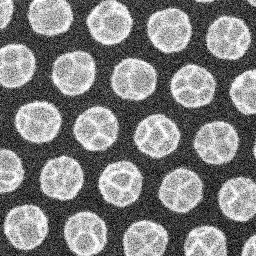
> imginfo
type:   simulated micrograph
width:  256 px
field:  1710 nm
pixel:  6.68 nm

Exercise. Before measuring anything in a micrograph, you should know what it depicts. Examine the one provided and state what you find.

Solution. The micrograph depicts a regular array of raised bodies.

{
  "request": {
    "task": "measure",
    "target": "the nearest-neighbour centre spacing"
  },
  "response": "59.3 px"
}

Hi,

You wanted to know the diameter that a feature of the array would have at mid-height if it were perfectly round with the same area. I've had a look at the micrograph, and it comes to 275 nanometres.